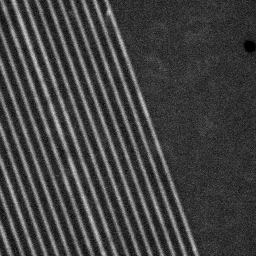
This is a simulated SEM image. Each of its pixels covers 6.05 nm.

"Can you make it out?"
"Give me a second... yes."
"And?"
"parallel lines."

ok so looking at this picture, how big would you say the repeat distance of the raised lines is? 66.3 nanometers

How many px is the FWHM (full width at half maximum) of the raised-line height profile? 2.48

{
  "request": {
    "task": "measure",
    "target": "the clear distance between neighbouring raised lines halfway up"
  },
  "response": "0.0506 microns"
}